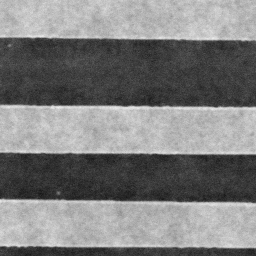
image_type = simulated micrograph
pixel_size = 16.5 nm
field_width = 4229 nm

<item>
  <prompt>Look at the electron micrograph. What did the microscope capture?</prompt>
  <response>lines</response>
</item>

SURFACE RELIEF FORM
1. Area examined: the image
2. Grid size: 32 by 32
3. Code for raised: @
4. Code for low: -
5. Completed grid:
@@@@@@@@@@@@@@@@@@@@@@@@@@@@@@@@
@@@@@@@@@@@@@@@@@@@@@@@@@@@@@@@@
@@@@@@@@@@@@@@@@@@@@@@@@@@@@@@@@
@@@@@@@@@@@@@@@@@@@@@@@@@@@@@@@@
@@@@@@@@@@@@@@@@@@@@@@@@@@@@@@@@
--------------------------------
--------------------------------
--------------------------------
--------------------------------
--------------------------------
--------------------------------
--------------------------------
--------------------------------
@@@@@@@@@@@@@@@@@@@@@@@@@@@@@@@@
@@@@@@@@@@@@@@@@@@@@@@@@@@@@@@@@
@@@@@@@@@@@@@@@@@@@@@@@@@@@@@@@@
@@@@@@@@@@@@@@@@@@@@@@@@@@@@@@@@
@@@@@@@@@@@@@@@@@@@@@@@@@@@@@@@@
@@@@@@@@@@@@@@@@@@@@@@@@@@@@@@@@
--------------------------------
--------------------------------
--------------------------------
--------------------------------
--------------------------------
--------------------------------
@@@@@@@@@@@@@@@@@@@@@@@@@@@@@@@@
@@@@@@@@@@@@@@@@@@@@@@@@@@@@@@@@
@@@@@@@@@@@@@@@@@@@@@@@@@@@@@@@@
@@@@@@@@@@@@@@@@@@@@@@@@@@@@@@@@
@@@@@@@@@@@@@@@@@@@@@@@@@@@@@@@@
@@@@@@@@@@@@@@@@@@@@@@@@@@@@@@@@
--------------------------------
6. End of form